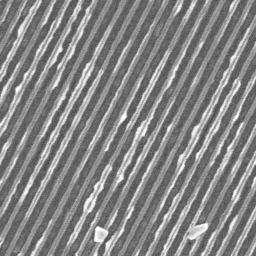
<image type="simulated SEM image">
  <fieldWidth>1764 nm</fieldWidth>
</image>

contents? parallel lines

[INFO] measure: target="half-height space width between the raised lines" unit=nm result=52.9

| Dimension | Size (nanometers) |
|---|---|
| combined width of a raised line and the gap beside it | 86.7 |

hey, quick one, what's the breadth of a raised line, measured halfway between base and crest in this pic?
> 30.7 nanometres